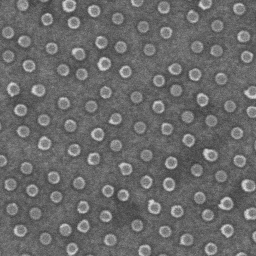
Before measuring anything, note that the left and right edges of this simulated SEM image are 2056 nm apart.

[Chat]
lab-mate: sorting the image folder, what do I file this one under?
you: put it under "a regular array of raised bodies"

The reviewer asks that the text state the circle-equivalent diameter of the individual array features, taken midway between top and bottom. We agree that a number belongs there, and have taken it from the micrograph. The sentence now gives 93.7 nanometers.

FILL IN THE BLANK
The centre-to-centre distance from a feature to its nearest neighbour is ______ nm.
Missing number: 183